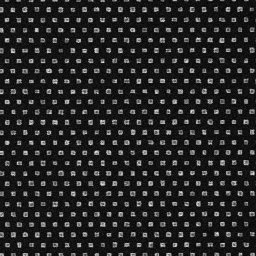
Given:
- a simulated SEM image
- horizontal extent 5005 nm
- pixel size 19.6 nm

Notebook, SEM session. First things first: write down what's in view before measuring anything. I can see a regular array of raised bodies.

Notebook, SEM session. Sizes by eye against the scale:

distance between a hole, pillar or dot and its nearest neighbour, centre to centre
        0.226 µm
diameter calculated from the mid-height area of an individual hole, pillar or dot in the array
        88.3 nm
